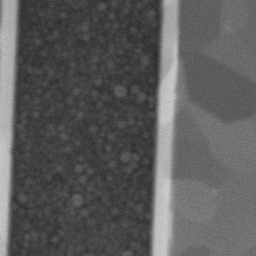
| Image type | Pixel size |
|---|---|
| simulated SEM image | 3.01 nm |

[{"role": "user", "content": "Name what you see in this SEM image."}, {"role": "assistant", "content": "one or a few lines or trenches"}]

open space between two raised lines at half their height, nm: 481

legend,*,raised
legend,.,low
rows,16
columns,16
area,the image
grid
*..........*****
*..........*****
*..........*****
..........******
..........******
..........******
..........******
..........******
..........******
..........******
..........******
..........******
..........******
..........******
..........******
..........******